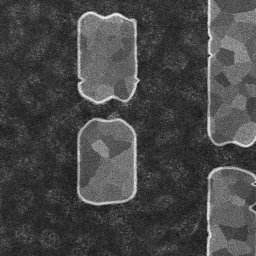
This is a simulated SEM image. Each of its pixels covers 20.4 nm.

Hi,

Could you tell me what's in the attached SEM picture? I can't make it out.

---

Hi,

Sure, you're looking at one or a few lines or trenches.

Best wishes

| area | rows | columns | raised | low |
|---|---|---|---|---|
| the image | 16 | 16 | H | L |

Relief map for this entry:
LLLLLLLLLLLLLHHH
LLLLLHHHLLLLLHHH
LLLLLHHHLLLLLHHH
LLLLLHHHLLLLLHHH
LLLLLHHHHLLLLHHH
LLLLLHHHLLLLLHHH
LLLLLLLLLLLLLHHH
LLLLLLLLLLLLLHHH
LLLLLHHHLLLLLHHH
LLLLLHHHLLLLLLLL
LLLLLHHHLLLLLLLL
LLLLLHHHLLLLLHHH
LLLLLHHHLLLLLHHH
LLLLLLLLLLLLLHHH
LLLLLLLLLLLLLHHH
LLLLLLLLLLLLLHHH